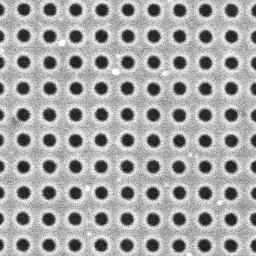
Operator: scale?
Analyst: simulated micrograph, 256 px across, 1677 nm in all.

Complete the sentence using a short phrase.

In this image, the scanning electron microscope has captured a regular array of holes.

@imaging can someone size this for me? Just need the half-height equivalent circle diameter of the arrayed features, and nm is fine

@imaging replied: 92.1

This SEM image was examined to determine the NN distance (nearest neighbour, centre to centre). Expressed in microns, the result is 0.169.